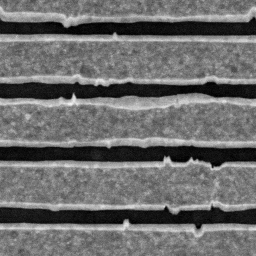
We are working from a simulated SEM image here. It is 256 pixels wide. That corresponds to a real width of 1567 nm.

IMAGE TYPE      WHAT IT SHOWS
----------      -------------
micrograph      one or a few lines or trenches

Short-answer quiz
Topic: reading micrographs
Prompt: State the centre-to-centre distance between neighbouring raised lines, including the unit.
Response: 385 nm